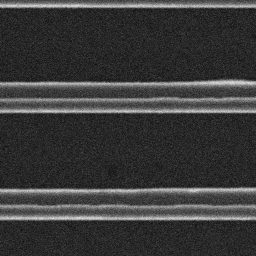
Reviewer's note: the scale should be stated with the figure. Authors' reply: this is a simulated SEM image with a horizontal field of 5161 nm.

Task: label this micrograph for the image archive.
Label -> lines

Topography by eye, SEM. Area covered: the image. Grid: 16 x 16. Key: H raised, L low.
LLLLLLLLLLLLLLLL
LLLLLLLLLLLLLLLL
LLLLLLLLLLLLLLLL
LLLLLLLLLLLLLLLL
LLLLLLLLLLLLLLLL
HHHHHHHHHHHHHHHH
HHHHHHHHHHHHHHHH
LLLLLLLLLLLLLLLL
LLLLLLLLLLLLLLLL
LLLLLLLLLLLLLLLL
LLLLLLLLLLLLLLLL
LLLLLLLLLLLLLLLL
HHHHHHHHHHHHHHHH
HHHHHHHHHHHHHHHH
LLLLLLLLLLLLLLLL
LLLLLLLLLLLLLLLL